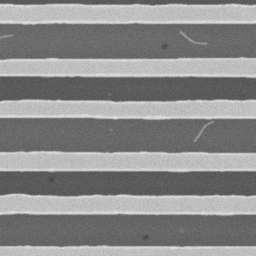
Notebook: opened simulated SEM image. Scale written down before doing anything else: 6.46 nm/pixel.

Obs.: lines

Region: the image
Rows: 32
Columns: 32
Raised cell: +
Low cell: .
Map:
................................
++++++++++++++++++++++++++++++++
++++++++++++++++++++++++++++++++
................................
................................
................................
................................
++++++++++++++++++++++++++++++++
++++++++++++++++++++++++++++++++
............++++++++++...+++++++
................................
................................
................................
++++++++++++++++++++++++++++++++
++++++++++++++++++++++++++++++++
................................
................................
................................
................................
++++++++++++++++++++++++++++++++
++++++++++++++++++++++++++++++++
................................
................................
................................
+++++......++.+++.........++.+..
++++++++++++++++++++++++++++++++
++++++++++++++++++++++++++++++++
................................
................................
................................
................................
++++++++++++++++++++++++++++++++